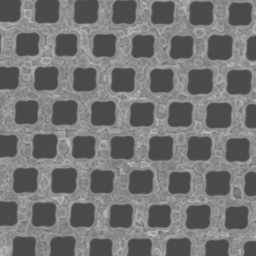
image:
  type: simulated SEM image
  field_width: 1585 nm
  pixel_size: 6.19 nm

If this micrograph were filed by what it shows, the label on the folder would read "a regular array of holes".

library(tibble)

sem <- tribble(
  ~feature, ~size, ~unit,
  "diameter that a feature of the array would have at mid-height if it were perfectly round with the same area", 159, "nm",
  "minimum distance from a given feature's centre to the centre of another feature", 38.4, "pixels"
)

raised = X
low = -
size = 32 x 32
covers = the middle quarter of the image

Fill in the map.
XXXXXXXXXXXXXXXXXXXXXXXXXXXXXXXX
XXX-----XXXX------XXXX-----XXXXX
XX------XXXX------XXXX-----XXXX-
XX------XXXX------XXXX-----XXXX-
XX------XXXX------XXXX-----XXXX-
XX------XXXX------XXX------XXXX-
XXX----XXXXX-----XXXXX-----XXXX-
XXXXXXXXXXXXXXXXXXXXXXXXXXXXXXXX
XXXXXXXXXXXXXXXXXXXXXXXXXXXXXXXX
---XXXX-----XXXXXXXXX-XXXXXXXXXX
---XXXX------XXXX-----XXXX------
---XXXX------XXXX-----XXXX------
---XXXX------XXXX-----XXXX------
---XXXX------XXXX-----XXXX------
---XXXX------XXX------XXXX------
XXXXXXXXXXXXXXXXX----XXXXXX----X
XXXXXXXXXXXXXXXXXXXXXXXXXXXXXXXX
XXXXXXXXXXXXXXXXXXXXXXXXXXXXXXXX
XXX-----XXXX-----XXXXX-----XXXX-
XX------XXXX------XXX------XXXX-
XX------XXXX------XXX------XXXX-
XX------XXXX-----XXXX------XXXX-
XX------XXXX------XXX------XXXX-
XXX-XX-XXXXX-----XXXX------XXXX-
XXXXXXXXXXXXXXXXXXXXXXXXXXXXXXXX
XXXXXXXXXXXXXXXXXXXXXXXXXXXXXXXX
---XXXXXXXXXXXXXXX-X-XXXXXXXXXXX
---XXXX-----XXXXX-----XXXXX-----
---XXXX------XXX------XXXX------
---XXXX-----XXXX------XXXX------
---XXXX-----XXXX------XXXX------
---XXXX-----XXXX------XXXX-----X